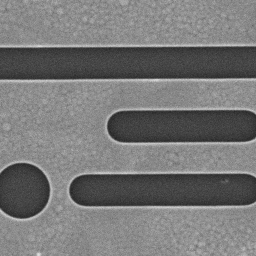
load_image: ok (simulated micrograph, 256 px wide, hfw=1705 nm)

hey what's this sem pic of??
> groups of lines, slits or small figures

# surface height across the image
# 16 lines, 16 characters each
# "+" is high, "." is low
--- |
++++++++++++++++
++++++++++++++++
++++++++++++++++
................
................
++++++++++++++++
++++++++++++++++
+++++++.........
+++++++.........
++++++++++++++++
..++++++++++++++
...+............
...++...........
+.++++++++++++++
++++++++++++++++
++++++++++++++++